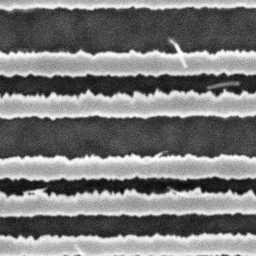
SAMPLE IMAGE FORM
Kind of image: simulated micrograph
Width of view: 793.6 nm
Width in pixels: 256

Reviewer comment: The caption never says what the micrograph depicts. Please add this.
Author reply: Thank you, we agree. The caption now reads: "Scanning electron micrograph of lines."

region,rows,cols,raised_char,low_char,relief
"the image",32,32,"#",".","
################################
................................
................................
................................
................................
................................
................#..#..#....###..
################################
################################
......#..#......................
................................
......................#.........
################################
################################
####.######..######...#....##.#.
................................
................................
................................
................................
.......................#........
################################
################################
....##..........................
................................
##.#####.#######################
################################
################################
................................
................................
................#..#.#..########
################################
################################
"